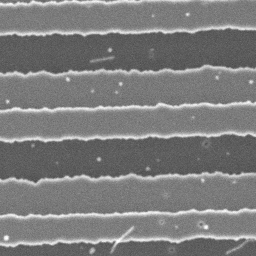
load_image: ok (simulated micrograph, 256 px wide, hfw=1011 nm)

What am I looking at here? lines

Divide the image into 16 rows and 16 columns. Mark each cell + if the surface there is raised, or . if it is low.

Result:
++++++++++++++++
++++++++++++++++
................
................
....++++++++++++
++++++++++++++++
++++++++++++++++
++++++++++++++++
++++++++++++++..
................
................
++++++++++++++++
++++++++++++++++
++++++++++++++++
++++++++++++++++
................